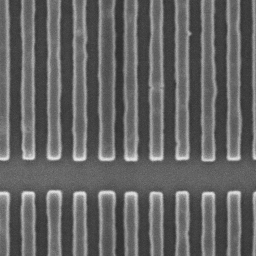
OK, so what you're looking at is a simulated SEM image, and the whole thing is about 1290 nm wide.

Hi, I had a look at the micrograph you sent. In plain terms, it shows parallel lines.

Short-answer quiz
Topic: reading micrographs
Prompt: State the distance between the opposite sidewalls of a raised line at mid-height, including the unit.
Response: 59.2 nanometers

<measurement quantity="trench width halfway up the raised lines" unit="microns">0.0687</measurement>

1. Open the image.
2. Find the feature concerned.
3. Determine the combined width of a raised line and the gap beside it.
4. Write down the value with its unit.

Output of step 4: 130 nm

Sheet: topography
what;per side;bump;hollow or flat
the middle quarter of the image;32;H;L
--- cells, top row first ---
LLLHHLLLLHHHHLLHHHLLLLHHHLLLHHHL
LLLHHLLLLHHHHLLHHHLLLLHHHLLLHHHL
LLLHHLLLLHHHHLLHHHLLLLHHHLLLHHHL
LLLHHLLLLHHHHLLHHHLLLLHHHLLLHHHL
LLLHHLLLLHHHHLLHHHLLLHHHHLLLHHHL
LLLHHHLLLHHHHLLHHHLLLLHHHLLLHHHL
LLLHHHLLLHHHHLLHHHLLLLHHHLLLHHHL
LLHHHHLLLHHHHLLHHHLLLLHHHLLLHHHL
LLHHHHLLLHHHHLLHHHLLLLHHHLLLHHHL
LLHHHHLLLHHHLLLHHHLLLLHHHLLLHHHL
LLHHHLLLLHHHLLLHHHLLLLHHHLLLHHHL
LLHHHLLLLHHHHLLHHHLLLLHHHLLLHHHL
LLLHHLLLLHHHHLLHHHLLLLHHHLLLHHHL
LLHHHHLLLHHHHLLHHHLLLLHHHLLLHHHL
LLHHHHLLLHHHLLLHHHLLLLHHHLLLHHHL
LLHHHHLLLHHHLLLHHHLLLLHHHLLLHHHL
LLHHHHLLLHHHLLLHHHLLLLHHHLLLHHHL
LLHHHHLLLHHHLLLHHHLLLLHHHLLLHHHL
LLLHHLLLLHHHLLLHHHLLLLHHHLLLHHHL
LLLHHLLLLHHHLLLHHHLLLLHHHLLLHHHL
LLLHHLLLLHHHLLLHHHLLLLHHHLLLHHHL
LLLHHLLLLHHHLLLHHHLLLLHHHLLLHHHL
LLHHHLLLLHHHLLLHHHLLLLHHHLLLHHHL
LLHHHLLLLHHHLLLHHHLLLLHHHLLLHHHL
LLLLLLLLLLLLLLLLLLLLLLLLLLLLLLLL
LLLLLLLLLLLLLLLLLLLLLLLLLLLLLLLL
LLLLLLLLLLLLLLLLLLLLLLLLLLLLLLLL
LLLLLLLLLLLLLLLLLLLLLLLLLLLLLLLL
LLLLLLLLLLLLLLLLLLLLLLLLLLLLLLLL
LLLLLLLLLLLLLLLLLLLLLLLLLLLLLLLL
LLLLLLLLLLLLLLLLLLLLLLLLLLLLLLLL
LLLLLLLLLLLLLLLLLLLLLLLLLLLLLLLL